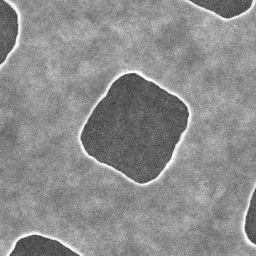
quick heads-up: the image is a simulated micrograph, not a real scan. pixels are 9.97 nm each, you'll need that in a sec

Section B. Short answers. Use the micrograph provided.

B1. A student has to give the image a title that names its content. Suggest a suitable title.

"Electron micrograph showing holes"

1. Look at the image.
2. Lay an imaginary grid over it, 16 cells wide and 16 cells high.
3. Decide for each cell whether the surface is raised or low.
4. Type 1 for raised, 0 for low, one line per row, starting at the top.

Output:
0111111111111000
0111111111111111
0111111111111111
0111111111111111
1111111111111111
1111111000111111
1111110000001111
1111100000001111
1111100000011111
1111100000011111
1111111000111111
1111111111111111
1111111111111111
1111111111111110
1111111111111110
1000111111111111